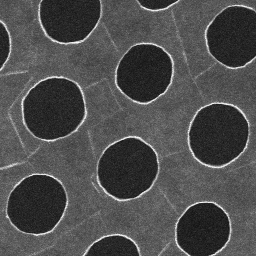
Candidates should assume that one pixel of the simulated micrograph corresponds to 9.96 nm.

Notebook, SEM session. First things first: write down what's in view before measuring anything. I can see holes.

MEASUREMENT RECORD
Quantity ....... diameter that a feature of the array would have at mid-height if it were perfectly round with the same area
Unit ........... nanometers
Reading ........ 599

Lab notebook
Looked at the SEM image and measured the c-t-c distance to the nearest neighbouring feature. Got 960 nanometers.